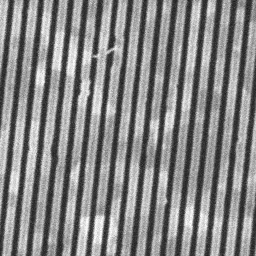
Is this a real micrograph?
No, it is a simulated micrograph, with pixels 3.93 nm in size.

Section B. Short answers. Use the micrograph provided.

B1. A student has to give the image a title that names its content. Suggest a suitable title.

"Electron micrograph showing parallel lines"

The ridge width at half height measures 6.72 pixels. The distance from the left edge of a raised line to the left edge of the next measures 58.1 nm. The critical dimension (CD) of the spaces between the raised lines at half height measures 30.3 nanometres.